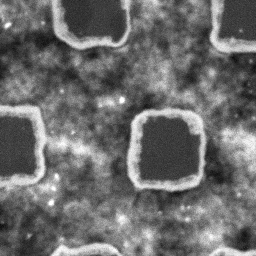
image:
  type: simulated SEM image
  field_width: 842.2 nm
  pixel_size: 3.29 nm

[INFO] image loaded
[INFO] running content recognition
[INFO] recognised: raised bodies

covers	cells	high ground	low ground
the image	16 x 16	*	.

...*****.....***
...*****.....***
....****.....***
................
................
................
................
***......***....
***.....*****...
***.....*****...
***.....*****...
.........***....
................
................
................
.....**.........